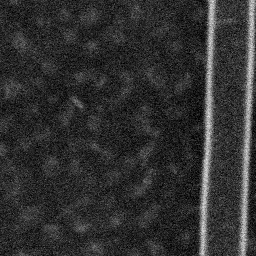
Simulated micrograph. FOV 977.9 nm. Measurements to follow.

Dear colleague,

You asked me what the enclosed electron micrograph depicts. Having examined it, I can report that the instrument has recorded one or a few lines or trenches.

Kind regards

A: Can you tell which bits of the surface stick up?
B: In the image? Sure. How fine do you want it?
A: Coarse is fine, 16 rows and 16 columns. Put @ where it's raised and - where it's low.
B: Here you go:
-------------@@@
-------------@@@
-------------@@@
-------------@@@
-------------@@@
-------------@@@
-------------@@@
-------------@@@
-------------@@-
-------------@@-
-------------@@-
-------------@@-
-------------@@-
-------------@@-
-------------@@-
-------------@@-